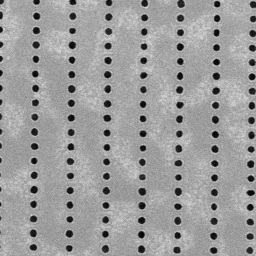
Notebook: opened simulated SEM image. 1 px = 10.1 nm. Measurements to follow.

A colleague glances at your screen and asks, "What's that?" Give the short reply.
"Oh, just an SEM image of a regular array of holes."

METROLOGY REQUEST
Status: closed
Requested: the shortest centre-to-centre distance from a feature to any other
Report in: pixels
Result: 14.4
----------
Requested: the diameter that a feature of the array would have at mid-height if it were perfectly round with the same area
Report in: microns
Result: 0.0744